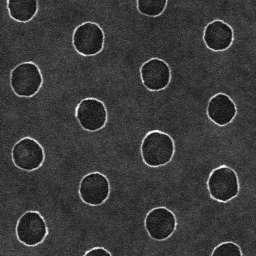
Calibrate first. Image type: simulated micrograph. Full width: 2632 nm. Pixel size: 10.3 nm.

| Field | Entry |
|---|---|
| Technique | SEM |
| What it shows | a regular array of holes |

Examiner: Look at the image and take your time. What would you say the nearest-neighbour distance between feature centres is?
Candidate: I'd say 763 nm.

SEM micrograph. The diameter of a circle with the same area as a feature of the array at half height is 314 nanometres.